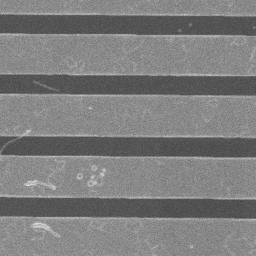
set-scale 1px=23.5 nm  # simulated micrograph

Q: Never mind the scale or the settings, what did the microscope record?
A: lines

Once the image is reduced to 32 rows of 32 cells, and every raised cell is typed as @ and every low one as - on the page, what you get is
@@@@@@@@@@@@@@@@@@@@@@@@@@@@@@@@
@@@@@@@@@@@@@@@@@@@@@@@@@@@@@@@@
--------------------------------
--------------------------------
@@@@@@@@@@@@@@@@@@@@@@@@@@@@@@@-
@@@@@@@@@@@@@@@@@@@@@@@@@@@@@@@@
@@@@@@@@@@@@@@@@@@@@@@@@@@@@@@@@
@@@@@@@@@@@@@@@@@@@@@@@@@@@@@@@@
@@@@@@@@@@@@@@@@@@@@@@@@@@@@@@@@
--------------------------------
--------------------------------
--------------------------------
@@@@@@@@@@@@@@@@@@@@@@@@@@@@@@@@
@@@@@@@@@@@@@@@@@@@@@@@@@@@@@@@@
@@@@@@@@@@@@@@@@@@@@@@@@@@@@@@@@
@@@@@@@@@@@@@@@@@@@@@@@@@@@@@@@@
@@@@@@@@@@@@@@@@@@@@@@@@@@@@@@@@
--------------------------------
--------------------------------
@@------------------------------
@@@@@@@@@@@@@@@@@@@@@@@@@@@@@@@@
@@@@@@@@@@@@@@@@@@@@@@@@@@@@@@@@
@@@@@@@@@@@@@@@@@@@@@@@@@@@@@@@@
@@@@@@@@@@@@@@@@@@@@@@@@@@@@@@@@
@@@@@@@@@@@@@@@@@@@@@@@@@@@@@@@@
--------------------------------
--------------------------------
@@@@@@@@@@@@@@@@@@@@@@@@@@@@@@@@
@@@@@@@@@@@@@@@@@@@@@@@@@@@@@@@@
@@@@@@@@@@@@@@@@@@@@@@@@@@@@@@@@
@@@@@@@@@@@@@@@@@@@@@@@@@@@@@@@@
@@@@@@@@@@@@@@@@@@@@@@@@@@@@@@@@